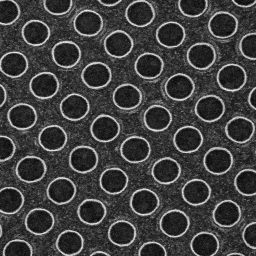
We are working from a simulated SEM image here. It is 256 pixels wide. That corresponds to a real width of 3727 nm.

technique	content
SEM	a regular array of raised bodies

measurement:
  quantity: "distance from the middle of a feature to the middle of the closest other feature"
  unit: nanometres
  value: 540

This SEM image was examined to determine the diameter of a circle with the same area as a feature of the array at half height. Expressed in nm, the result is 391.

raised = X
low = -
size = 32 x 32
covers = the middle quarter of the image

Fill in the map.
XX----XXXXX-------XXXXXXX-------
-----XXXXXX-------XXXXXX--------
-----XXXXXXX-------XXXXX--------
-----XXXXXXX---------X-----XXXX-
-----XXXXXX-------------X-XXXXXX
------XXXX----XXX---XXXX-XXXXXXX
-------------XXXXXX--XXX--XXXXXX
-------------XXXXXX---XXX-XXXXXX
XXXXX-------XXXXXXX---XXX--XXXX-
XXXXXX-------XXXXXX-----X-------
XXXXXX-------XXXXX----XX--------
XXXXXX---------------XXXXX------
XXXXX------------X--XXXXXXX-----
-XXX----XXXX-----X--XXXXXXX-----
--------XXXXX-------XXXXXXX-----
-------XXXXXXX-------XXXXX------
-------XXXXXXX--------XX-----XXX
-------XXXXXX---------------XXXX
X-------XXXXX----XX---------XXXX
---------------XXXXXX-------XXXX
--------------XXXXXXX-------XXXX
--XXXXX-------XXXXXXX--------XXX
--XXXXXX------XXXXXXX-----------
--XXXXXX-------XXXXXX-----------
--XXXXXX---------X-----XXXXX----
--XXXXXX--------------XXXXXXX---
---XXXX----XXX--------XXXXXXX---
----------XXXXX-------XXXXXXX---
---------XXXXXXX-------XXXXX----
XX-------XXXXXXX--------XXX----X
XXX------XXXXXXX--------------XX
XXX-------XXXXX----XX---------XX